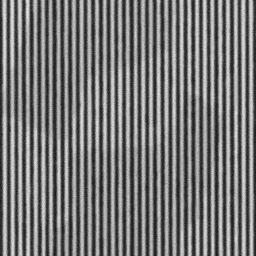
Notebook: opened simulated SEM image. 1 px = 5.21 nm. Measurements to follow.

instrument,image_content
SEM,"parallel lines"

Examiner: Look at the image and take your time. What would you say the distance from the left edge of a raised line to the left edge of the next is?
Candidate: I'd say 0.0401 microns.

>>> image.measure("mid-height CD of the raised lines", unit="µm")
0.0156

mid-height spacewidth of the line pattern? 5.01 px